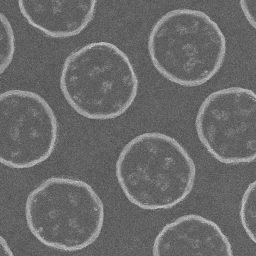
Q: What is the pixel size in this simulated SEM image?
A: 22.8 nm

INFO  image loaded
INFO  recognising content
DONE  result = raised bodies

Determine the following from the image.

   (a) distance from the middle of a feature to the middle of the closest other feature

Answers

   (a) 2220 nm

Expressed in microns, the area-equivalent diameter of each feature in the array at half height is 1.64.